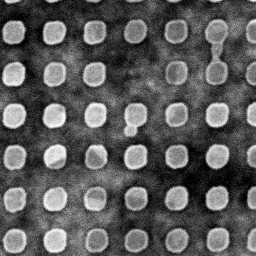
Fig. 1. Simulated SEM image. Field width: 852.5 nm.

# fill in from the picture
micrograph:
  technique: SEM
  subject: a regular array of raised bodies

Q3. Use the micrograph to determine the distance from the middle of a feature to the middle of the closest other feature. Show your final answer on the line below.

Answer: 135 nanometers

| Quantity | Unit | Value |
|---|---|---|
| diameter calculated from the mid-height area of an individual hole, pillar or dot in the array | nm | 75.5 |